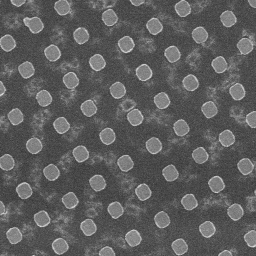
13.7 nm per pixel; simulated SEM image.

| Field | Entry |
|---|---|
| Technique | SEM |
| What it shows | a regular array of raised bodies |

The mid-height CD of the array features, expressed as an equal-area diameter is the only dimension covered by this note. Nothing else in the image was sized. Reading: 209 nm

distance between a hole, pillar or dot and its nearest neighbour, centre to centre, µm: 0.441